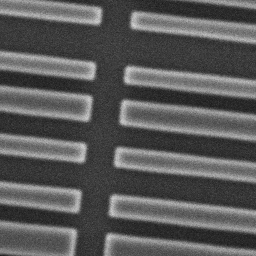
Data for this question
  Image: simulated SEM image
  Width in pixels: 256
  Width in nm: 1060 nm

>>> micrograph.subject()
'groups of lines, slits or small figures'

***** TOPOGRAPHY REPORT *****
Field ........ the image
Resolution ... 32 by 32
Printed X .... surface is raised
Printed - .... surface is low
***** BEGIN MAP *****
XXXXXXXXX-------------------XXXX
XXXXXXXXXXXXX-------------------
--------XXXXX----XXXXXXXX-------
-----------------XXXXXXXXXXXXXXX
--------------------------XXXXXX
--------------------------------
--------------------------------
XXXXXXXXX-----------------------
XXXXXXXXXXXX----X---------------
--------XXXX----XXXXXXXXXX------
-----------------XXXXXXXXXXXXXXX
XXXXXX--------------------XXXXXX
XXXXXXXXXXX---------------------
XXXXXXXXXXX----XXXXXXXXX--------
------XXXXX----XXXXXXXXXXXXXXXXX
---------------XXXXXXXXXXXXXXXXX
-----------------------XXXXXXXXX
XXXXXX-------------------------X
XXXXXXXXXXX---------------------
---XXXXXXXX----XXXXXXXX---------
---------------XXXXXXXXXXXXXXXXX
---------------------XXXXXXXXXXX
------------------------------XX
XXXXXX--------------------------
XXXXXXXXXX----------------------
-XXXXXXXXX----XXXXXXXXXX--------
--------------XXXXXXXXXXXXXXXXXX
------------------XXXXXXXXXXXXXX
XXXXXXX--------------------XXXXX
XXXXXXXXX-----X-----------------
XXXXXXXXX----XXXXXXXXXXX--------
XXXXXXXXX----XXXXXXXXXXXXXXXXXXX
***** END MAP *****